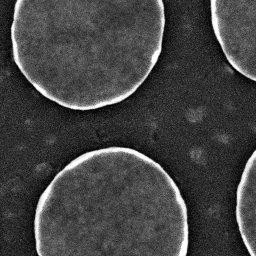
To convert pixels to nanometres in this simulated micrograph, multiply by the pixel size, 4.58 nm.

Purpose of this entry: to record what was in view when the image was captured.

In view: raised bodies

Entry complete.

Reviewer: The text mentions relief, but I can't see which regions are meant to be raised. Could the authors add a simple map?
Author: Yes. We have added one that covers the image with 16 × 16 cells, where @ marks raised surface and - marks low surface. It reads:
-@@@@@@@@@---@@@
-@@@@@@@@@---@@@
-@@@@@@@@@----@@
-@@@@@@@@@----@@
-@@@@@@@@------@
--@@@@@@@-------
----@@@---------
----------------
----------------
------@@@-------
----@@@@@@-----@
---@@@@@@@@----@
---@@@@@@@@----@
--@@@@@@@@@@---@
--@@@@@@@@@@---@
--@@@@@@@@@@---@